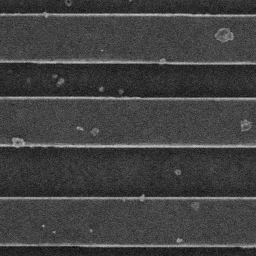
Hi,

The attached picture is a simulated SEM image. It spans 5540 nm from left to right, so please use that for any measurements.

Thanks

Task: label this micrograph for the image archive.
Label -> lines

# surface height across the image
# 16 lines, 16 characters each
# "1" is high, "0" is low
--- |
0000000000000000
1111111111111111
1111111111111111
1111111111111111
0000000000000000
0000000000000000
1111111111111111
1111111111111111
1111111111111111
0000000000000000
0000000000000000
0000000000000000
1111111111111111
1111111111111111
1111111111111111
0000000000000000